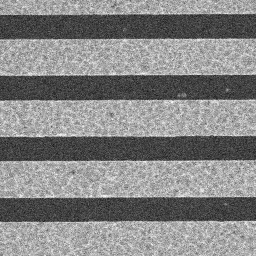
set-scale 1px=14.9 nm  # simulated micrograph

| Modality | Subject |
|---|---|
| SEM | one or a few lines or trenches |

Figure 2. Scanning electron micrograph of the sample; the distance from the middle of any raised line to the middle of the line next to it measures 891 nm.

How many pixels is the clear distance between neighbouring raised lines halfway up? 25.5